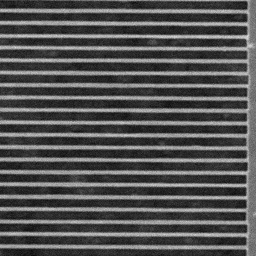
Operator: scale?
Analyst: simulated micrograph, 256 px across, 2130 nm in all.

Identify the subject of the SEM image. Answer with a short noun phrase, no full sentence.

parallel lines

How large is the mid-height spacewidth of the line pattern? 83.2 nm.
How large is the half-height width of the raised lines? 0.0218 microns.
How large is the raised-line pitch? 103 nm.